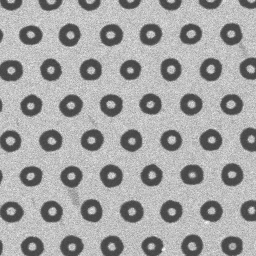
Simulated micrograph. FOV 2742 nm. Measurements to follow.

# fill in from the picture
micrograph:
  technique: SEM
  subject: a regular array of ring-shaped grooves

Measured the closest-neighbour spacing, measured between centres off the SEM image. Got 425 nm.